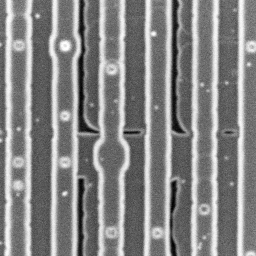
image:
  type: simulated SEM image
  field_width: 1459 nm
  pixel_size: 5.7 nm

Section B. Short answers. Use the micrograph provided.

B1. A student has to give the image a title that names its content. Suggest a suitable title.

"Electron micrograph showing wiring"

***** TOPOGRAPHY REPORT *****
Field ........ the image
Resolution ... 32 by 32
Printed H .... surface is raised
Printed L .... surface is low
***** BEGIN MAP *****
LHHHLLLHHHLLLHHLLLHHHLLLHHHLLLHH
LHHHLLLHHHLLLHHLLLHHHLLLHHHLLLHH
LHHHLLLHHHLLLHHLLLHHHLLLHHHLLLHH
LHHHLLLHHHLLLHHLLLHHHLLLHHHLLLHH
LHHHLLLHHHLLLHHLLLHHHLLLHHHLLLHH
LHHHLLHHHHLLLHHLLLHHHLLLHHHLLLHH
LHHHLLHHHHLLLHHLLLHHHLLLHHHLLLHH
LHHHLLLHHLLLLHHLLLHHHLLLHHHLLLHH
LHHHLLLHHLLLLHHLLLHHHLLLHHHLLLHH
LHHHLLLHHLLLLHHLLLHHHLLLHHHLLLHH
LHHHLLLHHLLLLHHLLLHHHLLLHHHLLLHH
LHHHLLLHHHLLLHHLLLHHHLLLHHHLLLHH
LHHHLLLHHHLLLHHLLLHHHLLLHHHLLLHH
LHHHLLLHHHLLLHHLLLHHHLLLHHHLLLHH
LHHHLLLHHHLLLHHLLLHHHLLLHHHLLLHH
LHHHLLLHHLLLLHHLLLHHHLLLHHHLLLHH
LHHHLLLHHLLLLHHLLLHHHLLLHHHLLLHH
LHHHLLLHHLLLLHHLLLHHHLLLHHHLLLHH
LHHHLLLHHLLLHHHHLLHHHLLLHHHLLLHH
LHHHLLLHHLLLHHHHLLHHHLLLHHHLLLHH
LHHHLLLHHLLLHHHHLLHHHLLLHHHLLLHH
LHHHLLLHHLLLHHHLLLHHHLLLHHHLLLHH
LHHHLLLHHLLLLHHLLLHHHLLLHHHLLLHH
LHHHLLLHHLLLLHHLLLHHHLLLHHHLLLHH
LHHHLLLHHLLLLHHLLLHHHLLLHHHLLLHH
LHHHLLLHHLLLLHHLLLHHHLLLHHHLLLHH
LHHHLLLHHLLLLHHLLLHHHLLLHHHLLLHH
LHHHLLLHHLLLLHHLLLHHHLLLHHHLLLHH
LHHHLLLHHLLLLHHLLLHHHLLLHHHLLLHH
LHHHLLLHHLLLLHHLLLHHHLLLHHHLLLHH
LHHHLLLHHLLLLHHLLLHHHLLLHHHLLLHH
LHHHLLLHHLLLLHHLLLHHHLLLHHHLLLHH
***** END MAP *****